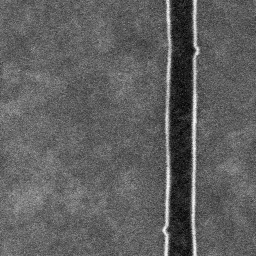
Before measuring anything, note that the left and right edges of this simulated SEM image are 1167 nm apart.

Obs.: one or a few lines or trenches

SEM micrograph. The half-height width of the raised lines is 28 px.